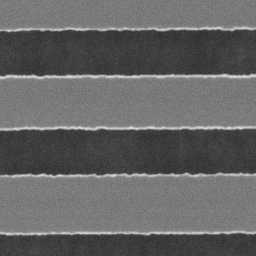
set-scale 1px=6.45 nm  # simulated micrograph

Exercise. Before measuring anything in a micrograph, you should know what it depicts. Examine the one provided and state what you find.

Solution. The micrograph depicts lines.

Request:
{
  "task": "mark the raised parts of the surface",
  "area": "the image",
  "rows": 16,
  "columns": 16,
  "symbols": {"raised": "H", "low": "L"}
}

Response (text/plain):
HHHHHHHHHHHHHHHH
HHHHHHHHHHHHHHHH
LLLLLLLLLLLLLLLL
LLLLLLLLLLLLLLLL
LLLLLLLLLLLLLLLL
HHHHHHHHHHHHHHHH
HHHHHHHHHHHHHHHH
HHHHHHHHHHHHHHHH
LLLLLLLLLLLLLLLL
LLLLLLLLLLLLLLLL
LLLLLLLLLLLLLLLL
HHHHHHHHHHHHHHHH
HHHHHHHHHHHHHHHH
HHHHHHHHHHHHHHHH
HHHHHHHHHHHHHHHH
LLLLLLLLLLLLLLLL